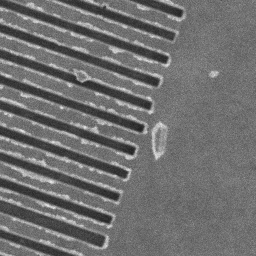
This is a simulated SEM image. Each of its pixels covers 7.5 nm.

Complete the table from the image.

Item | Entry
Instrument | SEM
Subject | parallel lines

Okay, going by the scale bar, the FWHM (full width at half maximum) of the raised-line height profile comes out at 109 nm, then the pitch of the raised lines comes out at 182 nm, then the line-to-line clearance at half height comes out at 72.5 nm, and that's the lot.